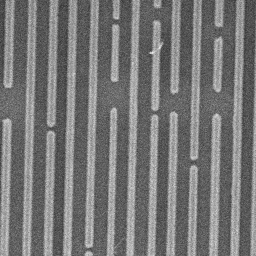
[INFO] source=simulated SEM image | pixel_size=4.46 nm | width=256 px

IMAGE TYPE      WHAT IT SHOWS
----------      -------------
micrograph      parallel lines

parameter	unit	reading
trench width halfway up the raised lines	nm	62.4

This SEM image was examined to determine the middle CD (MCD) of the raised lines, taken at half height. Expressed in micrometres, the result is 0.0295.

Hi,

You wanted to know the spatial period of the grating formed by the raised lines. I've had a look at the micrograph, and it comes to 93.4 nm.